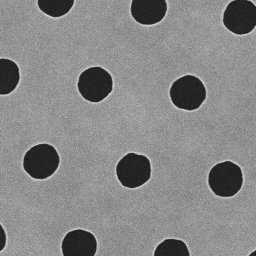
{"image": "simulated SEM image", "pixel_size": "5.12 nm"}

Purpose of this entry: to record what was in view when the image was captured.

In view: holes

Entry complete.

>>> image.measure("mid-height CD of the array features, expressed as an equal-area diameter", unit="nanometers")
180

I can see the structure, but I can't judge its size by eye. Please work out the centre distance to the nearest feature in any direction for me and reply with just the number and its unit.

476 nm